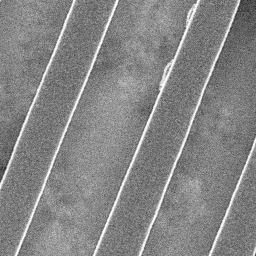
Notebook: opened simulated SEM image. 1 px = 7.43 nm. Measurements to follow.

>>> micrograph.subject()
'lines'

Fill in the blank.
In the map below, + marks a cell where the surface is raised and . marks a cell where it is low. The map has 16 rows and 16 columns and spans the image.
....+++.....+++.
....+++.....++..
....++.....+++..
...+++.....+++..
...+++.....++...
..+++.....+++...
..+++.....++....
..++.....+++....
.+++.....+++....
.+++.....++.....
+++.....+++....+
+++.....++.....+
++.....+++....++
++.....+++....++
++....+++.....++
+.....+++....+++